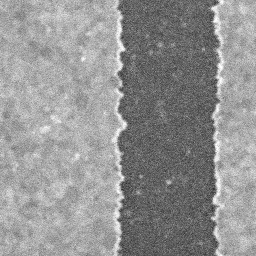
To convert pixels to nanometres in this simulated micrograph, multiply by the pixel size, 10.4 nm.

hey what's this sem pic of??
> one or a few lines or trenches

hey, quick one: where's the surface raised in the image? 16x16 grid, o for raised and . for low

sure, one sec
ooooooo......ooo
oooooooo......oo
ooooooo.......oo
ooooooo.......oo
ooooooo.......oo
oooooooo......oo
ooooooo.......oo
oooooooo.....ooo
ooooooo......ooo
ooooooo.......oo
ooooooo......ooo
oooooooo......oo
oooooooo.....ooo
ooooooo......ooo
ooooooo......ooo
ooooooo.......oo